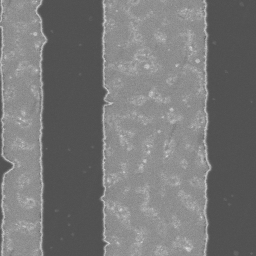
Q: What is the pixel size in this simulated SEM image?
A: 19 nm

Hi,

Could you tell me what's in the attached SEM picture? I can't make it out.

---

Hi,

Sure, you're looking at one or a few lines or trenches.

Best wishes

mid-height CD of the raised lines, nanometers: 1210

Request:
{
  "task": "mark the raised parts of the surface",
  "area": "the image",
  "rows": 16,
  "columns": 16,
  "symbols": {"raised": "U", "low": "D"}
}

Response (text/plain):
DDUUUUUDDDDDDUUU
DDDUUUUDDDDDDUUU
DDDUUUDDDDDDDUUU
DDDUUUUDDDDDDUUU
DDDUUUUDDDDDDUUU
DDDUUUUDDDDDDUUU
DDDUUUUDDDDDDUUU
DDDUUUDDDDDDDUUU
DDDUUUUDDDDDDUUU
DDDUUUUDDDDDDUUU
UDDUUUDDDDDDDUUU
DDDUUUUDDDDDDUUU
DDDUUUDDDDDDDUUU
DDDUUUUDDDDDDUUU
DDDUUUUDDDDDDUUU
DDDUUUUDDDDDDUUU